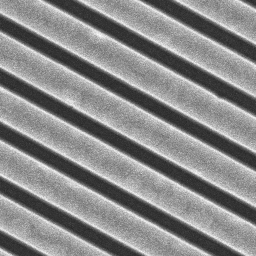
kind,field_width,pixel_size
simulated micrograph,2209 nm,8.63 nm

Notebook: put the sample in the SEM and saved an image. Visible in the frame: parallel lines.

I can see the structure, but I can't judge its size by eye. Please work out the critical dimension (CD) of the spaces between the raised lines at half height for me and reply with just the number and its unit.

15.2 pixels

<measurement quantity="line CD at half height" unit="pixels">32.1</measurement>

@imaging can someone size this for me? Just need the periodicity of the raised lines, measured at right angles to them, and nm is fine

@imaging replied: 410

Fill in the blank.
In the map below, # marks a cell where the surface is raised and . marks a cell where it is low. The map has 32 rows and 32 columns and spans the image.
######....########.....########.
########....########....########
.#########....########....######
...#########....########....####
#....#########....########....##
###....########.....########....
#####....########.....#######...
#######....########....########.
#########...#########....#######
..########....#########....#####
....########....#########....###
#.....########....########.....#
###....#########....########....
#####....#########....########..
#######....########....#########
.########....########....#######
..#########....########....#####
....#########....########....###
##....########....#########....#
####....########....########....
######....########....########..
#######.....########....########
.########....########....#######
...########....########....#####
....#########....########....###
##....#########....########....#
####....########.....########...
######....########....#########.
########....########....########
.#########....########....######
...########....#########....####
#....########....#########....##